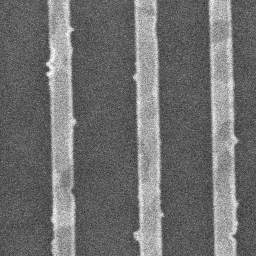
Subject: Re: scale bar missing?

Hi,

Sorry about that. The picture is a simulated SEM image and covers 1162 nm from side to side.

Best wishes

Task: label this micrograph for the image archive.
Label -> one or a few lines or trenches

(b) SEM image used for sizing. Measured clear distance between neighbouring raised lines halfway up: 265 nm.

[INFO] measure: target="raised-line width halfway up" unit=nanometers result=89.7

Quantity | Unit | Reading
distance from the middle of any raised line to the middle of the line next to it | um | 0.366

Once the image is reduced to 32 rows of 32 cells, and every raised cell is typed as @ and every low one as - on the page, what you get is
------@@@--------@@-------@@@---
------@@@--------@@-------@@@---
------@@@--------@@-------@@@---
------@@@--------@@-------@@@---
------@@@--------@@-------@@@---
------@@@--------@@@------@@@---
------@@@--------@@@------@@@---
------@@@--------@@@------@@@---
------@@@--------@@@------@@@---
------@@@--------@@@------@@@---
------@@@--------@@@------@@@---
------@@@--------@@@-------@@---
-------@@--------@@@-------@@---
-------@@--------@@@-------@@---
-------@@--------@@@-------@@---
-------@@--------@@@-------@@---
-------@@--------@@@-------@@---
-------@@--------@@@-------@@---
-------@@--------@@@-------@@---
-------@@--------@@@-------@@---
-------@@--------@@@-------@@---
-------@@--------@@@-------@@---
-------@@--------@@@-------@@---
-------@@---------@@-------@@---
-------@@--------@@@-------@@---
-------@@---------@@-------@@@--
-------@@---------@@-------@@---
-------@@---------@@-------@@@--
-------@@---------@@-------@@@--
-------@@--------@@@-------@@---
------@@@---------@@-------@@---
-------@@---------@@-------@@---